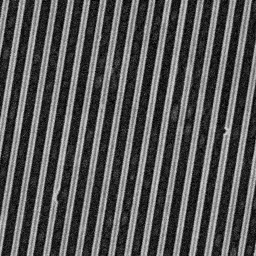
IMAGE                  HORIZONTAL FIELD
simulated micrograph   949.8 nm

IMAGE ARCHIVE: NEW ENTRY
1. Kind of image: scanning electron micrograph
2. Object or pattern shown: parallel lines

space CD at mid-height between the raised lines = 0.0412 µm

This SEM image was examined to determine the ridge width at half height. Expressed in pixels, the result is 4.31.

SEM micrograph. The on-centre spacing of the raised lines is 16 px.